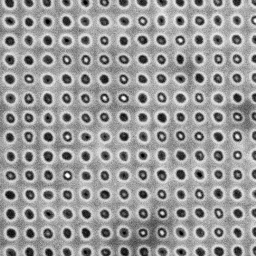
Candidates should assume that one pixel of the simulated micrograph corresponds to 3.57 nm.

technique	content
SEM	a regular array of holes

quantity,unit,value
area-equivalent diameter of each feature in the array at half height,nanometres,35.6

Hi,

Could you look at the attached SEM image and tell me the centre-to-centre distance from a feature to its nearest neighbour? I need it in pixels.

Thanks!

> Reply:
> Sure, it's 18.5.